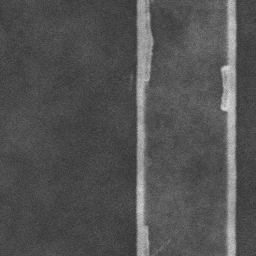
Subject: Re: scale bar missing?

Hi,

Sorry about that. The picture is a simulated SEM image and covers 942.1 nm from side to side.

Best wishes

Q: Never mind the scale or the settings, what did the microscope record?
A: one or a few lines or trenches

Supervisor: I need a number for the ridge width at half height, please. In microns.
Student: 0.342